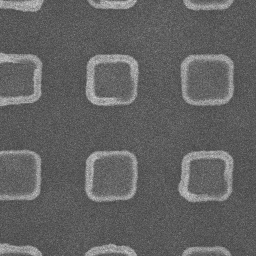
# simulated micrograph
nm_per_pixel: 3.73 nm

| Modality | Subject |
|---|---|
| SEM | raised bodies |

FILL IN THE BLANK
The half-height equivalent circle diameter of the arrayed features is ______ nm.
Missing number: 200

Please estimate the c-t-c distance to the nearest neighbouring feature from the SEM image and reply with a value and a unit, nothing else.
0.356 micrometres